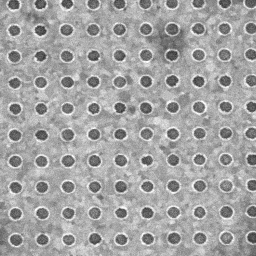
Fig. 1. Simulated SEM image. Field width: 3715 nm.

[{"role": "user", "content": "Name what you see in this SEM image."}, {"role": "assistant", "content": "a regular array of holes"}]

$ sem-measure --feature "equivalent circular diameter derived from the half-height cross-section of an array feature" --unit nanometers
179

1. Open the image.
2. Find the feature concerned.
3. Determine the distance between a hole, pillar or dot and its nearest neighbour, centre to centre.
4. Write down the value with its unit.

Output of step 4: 375 nm